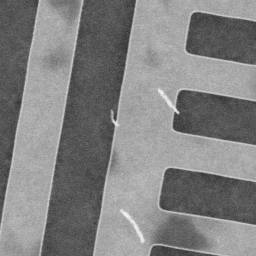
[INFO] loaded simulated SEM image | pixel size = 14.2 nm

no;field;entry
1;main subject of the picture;groups of lines, slits or small figures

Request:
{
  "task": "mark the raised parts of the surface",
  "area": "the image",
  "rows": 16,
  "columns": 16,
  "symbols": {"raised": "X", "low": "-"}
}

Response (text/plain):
--XXX---XXXXXXXX
--XXX---XXXX----
--XXX---XXXX----
--XXX---XXXX----
--XX----XXXXXXXX
--XX----XXXXXXXX
-XXX---XXXX-----
-XXX---XXXX-----
-XXX---XXXXXX---
-XXX---XXXXXXXXX
-XX----XXXXXXXXX
XXX----XXX------
XXX---XXXX------
XXX---XXXXXX----
XXX---XXXXXXXXXX
XXX---XXXX-XXXXX